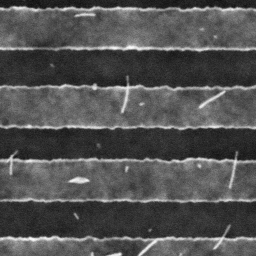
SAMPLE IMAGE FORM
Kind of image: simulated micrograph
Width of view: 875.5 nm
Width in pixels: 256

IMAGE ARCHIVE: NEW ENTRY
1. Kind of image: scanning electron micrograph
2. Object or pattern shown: lines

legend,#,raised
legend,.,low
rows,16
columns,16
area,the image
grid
##..#####...##..
################
################
................
................
################
################
################
................
................
################
################
################
................
................
################